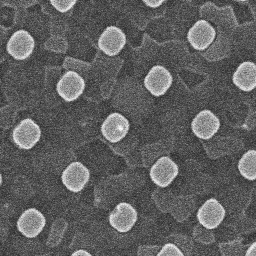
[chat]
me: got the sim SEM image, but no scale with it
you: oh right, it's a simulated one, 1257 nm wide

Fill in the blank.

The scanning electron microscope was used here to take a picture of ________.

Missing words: a regular array of raised bodies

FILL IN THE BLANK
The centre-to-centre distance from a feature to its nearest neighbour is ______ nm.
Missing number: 304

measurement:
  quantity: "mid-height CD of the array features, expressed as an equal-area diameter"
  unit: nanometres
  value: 130